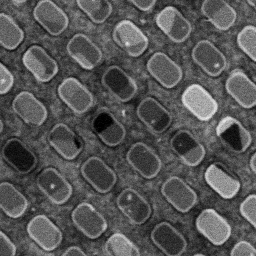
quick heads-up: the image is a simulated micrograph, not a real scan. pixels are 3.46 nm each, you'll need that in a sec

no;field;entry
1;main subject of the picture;a regular array of raised bodies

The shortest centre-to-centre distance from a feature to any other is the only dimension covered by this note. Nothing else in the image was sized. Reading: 45.8 pixels